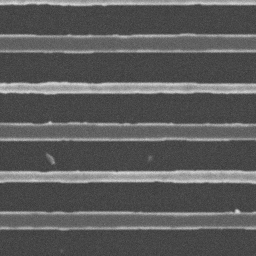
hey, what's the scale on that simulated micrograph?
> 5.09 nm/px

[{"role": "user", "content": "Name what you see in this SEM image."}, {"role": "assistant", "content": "lines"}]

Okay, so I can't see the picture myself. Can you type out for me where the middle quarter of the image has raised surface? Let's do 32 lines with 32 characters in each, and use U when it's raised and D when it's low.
DDDDDDDDDDDDDDDDDDDDDDDDDDDDDDDD
DDDDDDDDDDDDDDDDDDDDDDDDDDDDDDDD
DDDDDDDDDDDDDDDDDDDDDDDDDDDDDDDD
DDDDDDDDDDDDDDDDDDDDDDDDDDDDDDDD
DDDDDDDDDDDDDDDDDDDDDDDDDDDDDDDD
UUUUUUUUUUUUUUUUUUUUUUUUUUUUUUUU
UUUUUUUUUUUUUUUUUUUUUUUUUUUUUUUU
DDDDDDDDDDDDDDDDDDDDDDDDDDDDDDDD
DDDDDDDDDDDDDDDDDDDDDDDDDDDDDDDD
DDDDDDDDDDDDDDDDDDDDDDDDDDDDDDDD
DDDDDDDDDDDDDDDDDDDDDDDDDDDDDDDD
DDDDDDDDDDDDDDDDDDDDDDDDDDDDDDDD
DDDDDDDDDDDDDDDDDDDDDDDDDDDDDDDD
DDDDDDDDDDDDDDDDDDDDDDDDDDDDDDDD
DDDDDDDDDDDDDDDDDDDDDDDDDDDDDDDD
UUUUUUUUUUUUUUUUUUUUUUUUUUUUUUUU
UUUUUUUUUUUUUUUUUUUUUUUUUUUUUUUU
UUUUUUUUUUUUUUUUUUUUUUUUUUUUUUUU
UUUUUUUUUUUUUUUUUUUUUUUUUUUUUUUU
DDDDDDDDDDDDDDDDDDDDDDDDDDDDDDDD
DDDDDDDDDDDDDDDDDDDDDDDDDDDDDDDD
DDDDDDDDDDDDDDDDDDDDDDDDDDDDDDDD
DDDDDDDDDDDDDDDDDDDDDDDDDDDDDDDD
DDDDDDDDDDDDDDDDDDDDDDDDDDDDDDDD
DDDDDDDDDDDDDDDDDDDDDDDDDDDDDDDD
DDDDDDDDDDDDDDDDDDDDDDDDDDDDDDDD
DDDDDDDDDDDDDDDDDDDDDDDDDDDDDDDD
UUUUUUUUUUUUUUUUUUUUUUUUUUUUUUUU
UUUUUUUUUUUUUUUUUUUUUUUUUUUUUUUU
UUUUUUDDDDDDDDDDDDDDDDDDDDDUUUUU
DDDDDDDDDDDDDDDDDDDDDDDDDDDDDDDD
DDDDDDDDDDDDDDDDDDDDDDDDDDDDDDDD